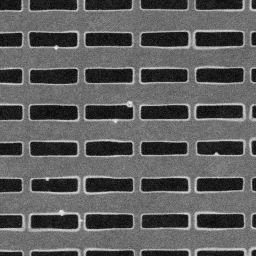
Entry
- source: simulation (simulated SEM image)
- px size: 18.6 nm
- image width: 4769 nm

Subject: groups of lines, slits or small figures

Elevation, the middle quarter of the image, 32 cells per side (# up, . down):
################################
...##............##............#
...##............##............#
...##............##............#
...##............##...........##
################################
################################
################################
################################
################################
...##...........###............#
...##.............#............#
....#.............#............#
...##............##............#
################################
################################
################################
################################
################################
...###...........###..........##
...##............##............#
...##............##............#
...##............##............#
################################
################################
################################
################################
################################
...##............###...........#
....#............##............#
....#............##............#
...##............##............#